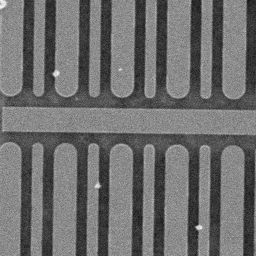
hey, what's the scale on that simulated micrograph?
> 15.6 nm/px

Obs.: groups of lines, slits or small figures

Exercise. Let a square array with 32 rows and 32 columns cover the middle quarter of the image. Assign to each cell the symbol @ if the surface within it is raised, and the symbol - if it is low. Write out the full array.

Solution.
@@@----@@---@@@@@---@@@---@@@@@-
@@@----@@---@@@@@---@@@---@@@@@-
@@@----@@---@@@@@---@@@---@@@@@-
@@@----@@---@@@@@---@@@---@@@@@-
@@@----@@---@@@@@---@@@---@@@@@-
@@@----@@---@@@@@---@@@---@@@@@-
@@@---@@@---@@@@@---@@@---@@@@@-
@@-----@@----@@@----@@@---@@@@@-
----------------------------@---
--------------------------------
--------------------------------
@@@@@@@@@@@@@@@@@@@@@@@---------
@@@@@@@@@@@@@@@@@@@@@@@@@@@@@@@@
@@@@@@@@@@@@@@@@@@@@@@@@@@@@@@@@
@@@@@@@@@@@@@@@@@@@@@@@@@@@@@@@@
@@@@@@@@@@@@@@@@@@@@@@@@@@@@@@@@
@@@@@@@@@@@@@@@@@@@@@@@@@@@@@@@@
--------------------------------
--------------------------------
--------------------------------
@@----@@-----@@@-----@-----@@---
@@@---@@@---@@@@@---@@@---@@@@@-
@@@---@@@---@@@@@---@@@---@@@@@-
@@@---@@@---@@@@@---@@@---@@@@@-
@@@---@@@---@@@@@---@@@---@@@@@-
@@@---@@@---@@@@@---@@@---@@@@@-
@@@---@@@---@@@@@---@@----@@@@@-
@@@---@@@---@@@@@---@@----@@@@@-
@@@---@@@---@@@@@---@@----@@@@@-
@@@---@@@---@@@@@---@@----@@@@@-
@@@---@@@---@@@@@---@@----@@@@@-
@@@---@@@---@@@@@---@@----@@@@@-